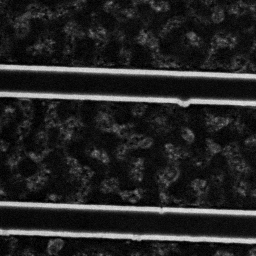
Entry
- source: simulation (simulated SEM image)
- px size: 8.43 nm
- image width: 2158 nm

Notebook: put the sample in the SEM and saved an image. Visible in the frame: one or a few lines or trenches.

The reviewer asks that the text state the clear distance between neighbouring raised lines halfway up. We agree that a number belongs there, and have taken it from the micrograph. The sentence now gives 921 nm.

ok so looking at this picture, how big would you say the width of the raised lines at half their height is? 238 nanometers